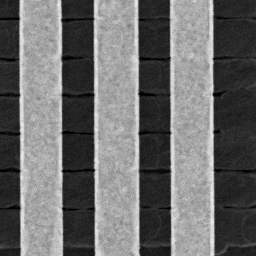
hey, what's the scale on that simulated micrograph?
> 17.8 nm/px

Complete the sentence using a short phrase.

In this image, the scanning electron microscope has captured wiring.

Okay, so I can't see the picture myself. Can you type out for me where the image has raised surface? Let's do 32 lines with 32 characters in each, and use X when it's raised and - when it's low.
---XXXX-----XXXXX----XXXXX------
---XXXX-----XXXXX----XXXXX------
---XXXX-----XXXXX-----XXXX------
---XXXX-----XXXXX-----XXXX------
---XXXX-----XXXXX-----XXXX------
---XXXX-----XXXXX-----XXXX------
---XXXX-----XXXXX-----XXXX------
---XXXX-----XXXXX-----XXXX------
---XXXX-----XXXXX-----XXXX------
---XXXX-----XXXXX-----XXXX------
---XXXX-----XXXXX-----XXXX------
---XXXX-----XXXXX-----XXXX------
---XXXX-----XXXXX-----XXXX------
---XXXX-----XXXXX-----XXXX------
---XXXX-----XXXXX-----XXXX------
---XXXX-----XXXXX-----XXXX------
---XXXX-----XXXXX-----XXXX------
---XXXXX----XXXXX-----XXXX------
---XXXXX----XXXXX-----XXXX------
---XXXXX----XXXXX-----XXXX------
---XXXXX----XXXXX-----XXXXX-----
---XXXXX----XXXXX-----XXXX------
---XXXXX----XXXXX-----XXXXX-----
---XXXXX----XXXXX-----XXXXX-----
---XXXXX----XXXXX-----XXXXX-----
---XXXXX----XXXXX-----XXXXX-----
---XXXX-----XXXXX-----XXXXX-----
---XXXXX----XXXXX-----XXXXX-----
---XXXXX----XXXXX-----XXXXX-----
---XXXXX----XXXXX-----XXXXX-----
---XXXX-----XXXXX-----XXXXX-----
---XXXX-----XXXXX-----XXXXX-----